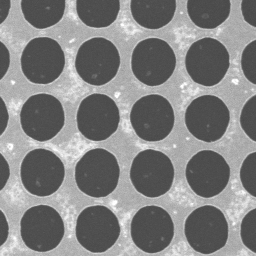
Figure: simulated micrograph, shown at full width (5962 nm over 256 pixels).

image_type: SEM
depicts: a regular array of holes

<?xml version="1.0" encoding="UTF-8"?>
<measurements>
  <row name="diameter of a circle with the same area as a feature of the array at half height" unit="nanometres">1080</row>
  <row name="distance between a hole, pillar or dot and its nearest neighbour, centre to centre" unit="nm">1280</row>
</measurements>